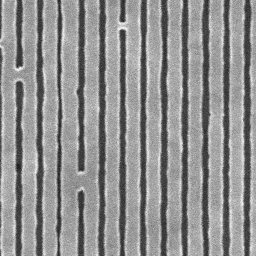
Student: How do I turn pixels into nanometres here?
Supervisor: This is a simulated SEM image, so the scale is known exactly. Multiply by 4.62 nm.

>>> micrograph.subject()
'parallel lines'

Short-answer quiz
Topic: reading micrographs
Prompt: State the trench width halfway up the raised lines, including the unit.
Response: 0.0318 µm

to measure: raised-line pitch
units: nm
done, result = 95.8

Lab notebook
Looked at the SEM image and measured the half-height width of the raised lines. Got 63 nm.